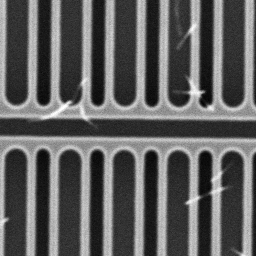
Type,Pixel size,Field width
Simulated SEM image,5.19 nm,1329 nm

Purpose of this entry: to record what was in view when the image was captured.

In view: groups of lines, slits or small figures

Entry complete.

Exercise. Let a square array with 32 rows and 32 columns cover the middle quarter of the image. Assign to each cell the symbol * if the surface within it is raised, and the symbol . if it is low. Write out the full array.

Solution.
.....**...**......**....**......
.....**...**......**....**......
.....**...**......**....**......
.....**...**......**....**.....*
....***...**......**....**.....*
....***...**......**....**......
.....**...**......**....**......
.....**...**......**....**.....*
....***...**......**....**......
....***...***.....**....**.....*
*.******.*****...****..****...**
********************************
********************************
.....*......*...****************
................................
................................
................................
................................
*******************.............
********************************
********************************
...*****.*****..*****.******.***
....***...***.....**...***.....*
....**....**......**....**.....*
....**....**......**....**......
....**....**......**....**......
....**....**......**....**......
....**....**......**....**......
....**....**......**....**......
....**....**......**....**......
....**....**......**...***......
....**....**......**...***......